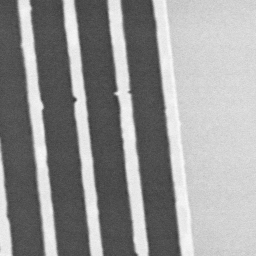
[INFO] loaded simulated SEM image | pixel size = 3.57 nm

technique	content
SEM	parallel lines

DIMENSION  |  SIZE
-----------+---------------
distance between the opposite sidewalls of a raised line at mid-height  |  43.4 nm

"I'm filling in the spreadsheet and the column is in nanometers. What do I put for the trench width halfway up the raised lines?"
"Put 117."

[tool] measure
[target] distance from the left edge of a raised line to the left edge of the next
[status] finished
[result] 161 nanometres